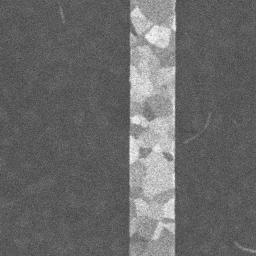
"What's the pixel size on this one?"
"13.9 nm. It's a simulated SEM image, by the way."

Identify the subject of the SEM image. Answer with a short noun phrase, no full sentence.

one or a few lines or trenches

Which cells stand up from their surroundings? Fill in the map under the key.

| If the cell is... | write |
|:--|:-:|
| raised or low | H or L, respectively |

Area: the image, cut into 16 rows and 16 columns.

LLLLLLLLHHHLLLLL
LLLLLLLLHHHLLLLL
LLLLLLLLHHHLLLLL
LLLLLLLLHHHLLLLL
LLLLLLLLHHHLLLLL
LLLLLLLLHHHLLLLL
LLLLLLLLHHHLLLLL
LLLLLLLLHHHLLLLL
LLLLLLLLHHHLLLLL
LLLLLLLLHHHLLLLL
LLLLLLLLHHHLLLLL
LLLLLLLLHHHLLLLL
LLLLLLLLHHHLLLLL
LLLLLLLLHHHLLLLL
LLLLLLLLHHHLLLLL
LLLLLLLLHHHLLLLL